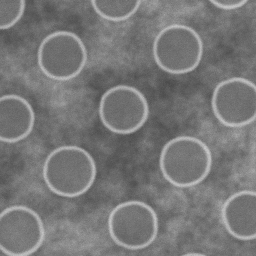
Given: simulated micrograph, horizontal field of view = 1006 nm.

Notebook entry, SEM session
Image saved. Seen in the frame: raised bodies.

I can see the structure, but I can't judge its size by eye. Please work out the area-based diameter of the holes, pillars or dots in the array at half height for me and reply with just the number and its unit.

184 nm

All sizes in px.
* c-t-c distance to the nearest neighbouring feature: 81.7